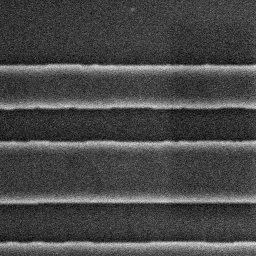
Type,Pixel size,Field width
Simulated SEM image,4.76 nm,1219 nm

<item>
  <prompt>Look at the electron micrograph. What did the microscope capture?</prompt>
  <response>lines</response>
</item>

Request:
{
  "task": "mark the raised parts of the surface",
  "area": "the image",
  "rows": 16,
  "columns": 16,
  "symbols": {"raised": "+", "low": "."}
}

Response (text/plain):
................
................
................
................
++++++++++++++++
++++++++++++++++
++++++++++++++++
................
................
++++++++++++++++
++++++++++++++++
++++++++++++++++
++++++++++++++++
................
................
++++++++++++++++